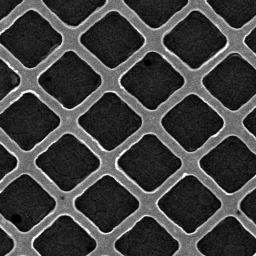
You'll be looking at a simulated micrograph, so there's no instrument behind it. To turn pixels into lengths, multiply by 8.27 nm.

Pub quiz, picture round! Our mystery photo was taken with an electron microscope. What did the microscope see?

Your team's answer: a regular array of holes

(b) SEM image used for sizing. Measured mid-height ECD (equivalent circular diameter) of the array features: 440 nanometers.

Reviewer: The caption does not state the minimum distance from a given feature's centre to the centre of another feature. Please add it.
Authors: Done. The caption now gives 0.472 um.